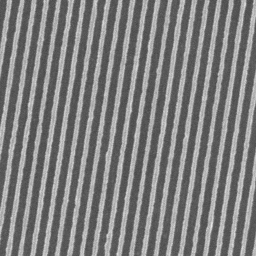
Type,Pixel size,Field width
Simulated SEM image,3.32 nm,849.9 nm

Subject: parallel lines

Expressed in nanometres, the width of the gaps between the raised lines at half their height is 28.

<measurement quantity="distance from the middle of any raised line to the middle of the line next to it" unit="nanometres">40.5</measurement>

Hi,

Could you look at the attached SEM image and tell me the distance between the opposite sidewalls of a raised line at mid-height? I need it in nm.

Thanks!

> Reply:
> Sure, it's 11.5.